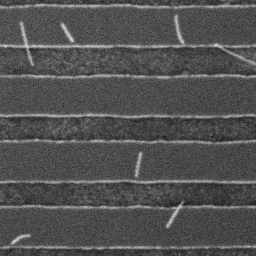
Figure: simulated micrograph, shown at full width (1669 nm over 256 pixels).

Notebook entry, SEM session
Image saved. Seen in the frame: lines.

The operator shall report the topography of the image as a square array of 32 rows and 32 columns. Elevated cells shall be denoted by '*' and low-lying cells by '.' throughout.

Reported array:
................................
********************************
********************************
********************************
********************************
********************************
................................
................................
................................
..**........****........******..
********************************
********************************
********************************
********************************
*.....****....****************..
................................
................................
....*...........................
********************************
********************************
********************************
********************************
********************************
................................
................................
................................
********************************
********************************
********************************
********************************
********************************
................................